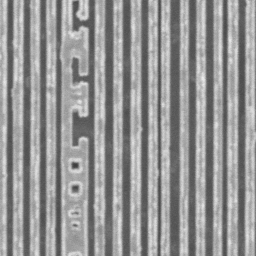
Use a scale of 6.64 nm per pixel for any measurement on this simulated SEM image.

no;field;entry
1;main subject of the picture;parallel lines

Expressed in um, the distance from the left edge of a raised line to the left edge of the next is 0.11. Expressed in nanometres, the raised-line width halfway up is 54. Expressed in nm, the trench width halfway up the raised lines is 54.